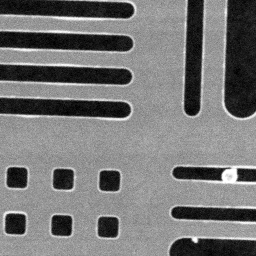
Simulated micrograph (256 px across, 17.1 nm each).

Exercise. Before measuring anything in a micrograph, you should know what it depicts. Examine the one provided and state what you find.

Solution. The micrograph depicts groups of lines, slits or small figures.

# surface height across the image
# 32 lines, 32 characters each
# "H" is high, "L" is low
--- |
LLLLLLLLLLLLLLLLHHHHHHHLLLHHLLLL
LLLLLLLLLLLLLLLLLHHHHHHLLLHHLLLL
HHHHHHHHHHHHHHHHHHHHHHHLLLHHLLLL
HHHHHHHHHHHHHHHHHHHHHHHLLLHHLLLL
LLLLLLLLLLLLLLLLHHHHHHHLLHHHLLLL
LLLLLLLLLLLLLLLLLHHHHHHLLHHHLLLL
HHHHHHHHHHHHHLLLHHHHHHHLLHHHLLLL
HHHHHHHHHHHHHHHHHHHHHHHLLHHHLLLL
LLLLLLLLLLLLLLLHHHHHHHHLLHHHLLLL
LLLLLLLLLLLLLLLLLHHHHHHLLHHHLLLL
HHHHHHHLLLLLLLLLHHHHHHHLLHHHLLLL
HHHHHHHHHHHHHHHHHHHHHHHLLHHHLLLL
LLLLLLLLLLLLLHHHHHHHHHHLLHHHLLLL
LLLLLLLLLLLLLLLLHHHHHHHLLHHHLLLL
HHHLLLLLLLLLLLLLHHHHHHHHHHHHHLLH
HHHHHHHHHHHHHHHHHHHHHHHHHHHHHHHH
HHHHHHHHHHHHHHHHHHHHHHHHHHHHHHHH
HHHHHHHHHHHHHHHHHHHHHHHHHHHHHHHH
HHHHHHHHHHHHHHHHHHHHHHHHHHHHHHHH
HHHHHHHHHHHHHHHHHHHHHHHHHHHHHHHH
HHHHHHHHHHHHHHHHHHHHHHHHHHHHHHHH
HLLHHHHLLHHHHLLHHHHHHHLLLLLLHHLL
HLLHHHLLLHHHLLLHHHHHHHHLLLLLHHLL
HHLHHHHLLHHHLLLHHHHHHHHHHHHHHHHH
HHHHHHHHHHHHHHHHHHHHHHHHHHHHHHHH
HHHHHHHHHHHHHHHHHHHHHHHHHHHHHHHH
HLHHHHHHHHHHHHHHHHHHHLLLLLLLLLLL
HLLHHHLLLHHHLLLHHHHHHHLLLLLLLLLL
HLLHHHLLLHHHLLLHHHHHHHHHHHHHHHHH
HHHHHHHLHHHHLLLHHHHHHHHHHHHHHHHH
HHHHHHHHHHHHHHHHHHHHHHLLLLLLLLLL
HHHHHHHHHHHHHHHHHHHHHLLLLLLLLLLL